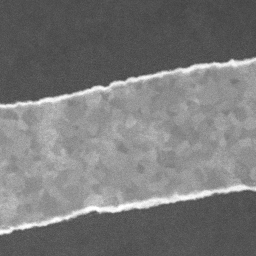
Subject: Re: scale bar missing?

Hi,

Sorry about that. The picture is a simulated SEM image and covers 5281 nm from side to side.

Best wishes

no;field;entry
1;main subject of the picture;one or a few lines or trenches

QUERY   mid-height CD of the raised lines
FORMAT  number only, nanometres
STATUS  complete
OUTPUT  2530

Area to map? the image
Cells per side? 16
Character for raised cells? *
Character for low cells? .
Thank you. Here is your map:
................
................
................
................
...........*****
......**********
.***************
****************
****************
****************
****************
****************
***********.....
****............
................
................